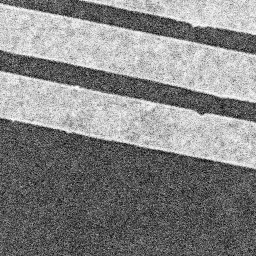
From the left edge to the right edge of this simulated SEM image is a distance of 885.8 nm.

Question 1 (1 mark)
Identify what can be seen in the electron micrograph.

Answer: one or a few lines or trenches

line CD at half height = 0.151 µm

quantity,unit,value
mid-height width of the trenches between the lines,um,0.0755